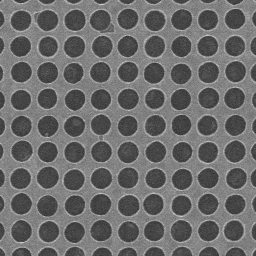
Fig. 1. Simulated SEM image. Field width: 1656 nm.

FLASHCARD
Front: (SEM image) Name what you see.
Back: a regular array of holes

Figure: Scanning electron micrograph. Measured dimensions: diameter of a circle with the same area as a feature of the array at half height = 137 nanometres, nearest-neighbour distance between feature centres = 167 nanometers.